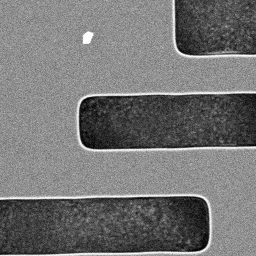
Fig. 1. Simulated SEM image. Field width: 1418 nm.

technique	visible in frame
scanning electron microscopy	groups of lines, slits or small figures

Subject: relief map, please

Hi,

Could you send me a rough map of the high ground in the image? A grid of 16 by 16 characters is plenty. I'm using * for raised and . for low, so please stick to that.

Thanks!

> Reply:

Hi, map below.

***********.....
***********.....
***********.....
************.***
****************
****************
*****...........
*****...........
*****...........
****************
****************
****************
.............***
.............***
.............***
.............***